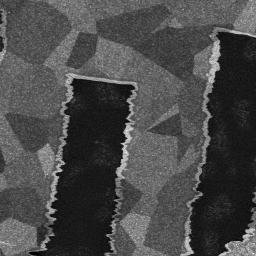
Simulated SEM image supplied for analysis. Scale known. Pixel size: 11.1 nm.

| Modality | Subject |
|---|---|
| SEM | one or a few lines or trenches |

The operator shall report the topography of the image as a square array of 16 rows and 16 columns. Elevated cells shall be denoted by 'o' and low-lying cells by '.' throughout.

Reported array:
oooooooooooooooo
oooooooooooooooo
ooooooooooooo...
ooooooooooooo...
ooooooooooooo...
oooo....ooooo...
oooo....ooooo...
oooo....ooooo...
oooo....ooooo...
oooo....ooooo...
oooo....ooooo...
ooo....ooooo....
ooo....ooooo....
ooo....ooooo....
ooo....ooooo....
ooo....ooooo..oo